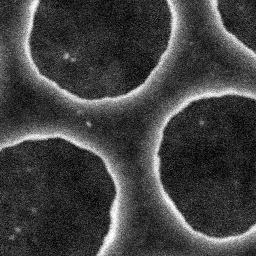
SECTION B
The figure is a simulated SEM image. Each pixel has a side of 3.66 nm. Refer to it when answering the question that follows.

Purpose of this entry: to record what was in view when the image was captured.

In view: holes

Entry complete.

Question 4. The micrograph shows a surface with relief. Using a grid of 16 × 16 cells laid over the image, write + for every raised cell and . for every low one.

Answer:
++.........+++..
++.........+++..
++.........++++.
++........++++++
+++.......++++++
++++.....+++++++
++++++++++++....
+++++++++++.....
++++++++++......
......++++......
.......+++......
.......+++......
.......++++.....
.......++++.....
.......+++++...+
......++++++++++